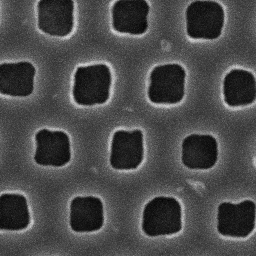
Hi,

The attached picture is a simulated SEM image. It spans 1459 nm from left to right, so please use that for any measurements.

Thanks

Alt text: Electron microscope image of holes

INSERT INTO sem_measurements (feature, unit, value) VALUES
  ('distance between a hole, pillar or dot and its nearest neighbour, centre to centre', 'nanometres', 424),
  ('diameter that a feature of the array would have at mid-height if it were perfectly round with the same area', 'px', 39.6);